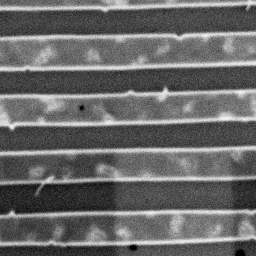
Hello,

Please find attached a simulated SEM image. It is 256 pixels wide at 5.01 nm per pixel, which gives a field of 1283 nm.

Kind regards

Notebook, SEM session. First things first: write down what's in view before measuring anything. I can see parallel lines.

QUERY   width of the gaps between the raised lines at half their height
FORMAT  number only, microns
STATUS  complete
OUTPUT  0.137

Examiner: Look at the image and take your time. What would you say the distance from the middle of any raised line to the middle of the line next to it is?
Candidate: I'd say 0.294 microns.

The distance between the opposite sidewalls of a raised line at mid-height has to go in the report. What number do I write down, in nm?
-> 156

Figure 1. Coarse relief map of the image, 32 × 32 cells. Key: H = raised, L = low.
HHHHHHHHHHHHHHHHHHHHHHHHHHHHHHHH
LLLLLLLLLLLLLLLLLLLLLLLLLLLLLLLL
LLLLLLLLLLLLLLLLLLLLLLLLLLLLLLLL
LLLLLLLLLLLLLLLLLLLLLLLLLLLLLLLL
LLLLLLLLHLLLLHHHHHHHHHLHHHHHHHHH
HHHHHHHHHHHHHHHHHHHHHHHHHHHHHHHH
HHHHHHHHHHHHHHHHHHHHHHHHHHHHHHHH
HHHHHHHHHHHHHHHHHHHHHHHHHHHHHHHH
HHHHHHHHHHHHHHHLLLLLLLLLLLLLLLLL
LLLLLLLLLLLLLLLLLLLLLLLLLLLLLLLL
LLLLLLLLLLLLLLLLLLLLLLLLLLLLLLLL
LLLLLLLLLLLLLLLLLLLLHLLLLLLHHHHH
HHHHHHHHHHHHHHHHHHHHHHHHHHHHHHHH
HHHHHHHHHHHHHHHHHHHHHHHHHHHHHHHH
HHHHHHHHHHHHHHHHHHHHHHHHHHHHHHHH
HHHHHHHHHHHHLLLLLLLLLLLLLLLLLLLL
LLLLLLLLLLLLLLLLLLLLLLLLLLLLLLLL
LLLLLLLLLLLLLLLLLLLLLLLLLLLLLLLL
LLLLLLLLLLLLLLLLLLLLLLLLLLLLLHHH
HHHHHHHHHHHHHHHHHHHHHHHHHHHHHHHH
HHHHHHHHHHHHHHHHHHHHHHHHHHHHHHHH
HHHHHHHHHHHHHHHHHHHHHHHHHHHHHHHH
HHHHHHHHHHHHHHLLLLLLLLLLLLLLLLLL
LLLLLLLLLLLLLLLLLLLLLLLLLLLLLLLL
LLLLLLLLLLLLLLLLLLLLLLLLLLLLLLLL
LLLLLLLLLLLLLLLLLLLLLLLLLLLLLLLL
LLLLLLLLLLLLLLLLLLLLHHHHHHHHHHHH
HHHHHHHHHHHHHHHHHHHHHHHHHHHHHHHH
HHHHHHHHHHHHHHHHHHHHHHHHHHHHHHHH
HHHHHHHHHHHHHHHHHHHHHHHHHHHHHHHH
HHHHHLLHHHLLLLLHLLLLLLLLLLLLLLLL
LLLLLLLLLLLLLLLLLLLLLLLLLLLLLLLL